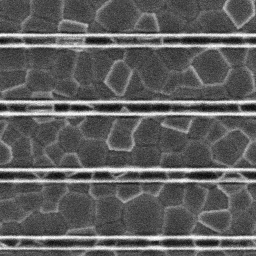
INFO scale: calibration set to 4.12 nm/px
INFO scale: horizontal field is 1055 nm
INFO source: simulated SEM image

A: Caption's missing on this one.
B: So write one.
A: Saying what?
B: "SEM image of one or a few lines or trenches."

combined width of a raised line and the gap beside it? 278 nanometres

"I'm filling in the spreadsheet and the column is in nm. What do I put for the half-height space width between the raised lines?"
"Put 226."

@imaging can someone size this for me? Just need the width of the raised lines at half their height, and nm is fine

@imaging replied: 50.4